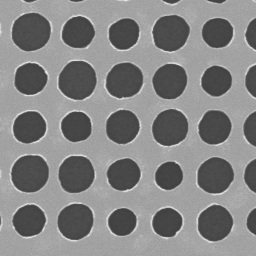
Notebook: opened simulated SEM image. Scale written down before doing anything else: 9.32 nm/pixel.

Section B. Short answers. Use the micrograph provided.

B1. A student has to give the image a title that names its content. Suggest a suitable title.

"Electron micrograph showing a regular array of holes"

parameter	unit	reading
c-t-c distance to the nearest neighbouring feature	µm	0.431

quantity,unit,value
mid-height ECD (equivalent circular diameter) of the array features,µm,0.312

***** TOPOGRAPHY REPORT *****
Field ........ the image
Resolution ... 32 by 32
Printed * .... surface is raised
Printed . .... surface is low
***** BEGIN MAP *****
********************************
********************************
**....***..****..***...***..****
**....**....**...**.....*....**.
**....**....**...**.....*....**.
**....**...***...**....***..***.
********************************
********************************
**...***....**...***...***..***.
**....*.....*.....*....**....**.
**....*.....*.....*....**....**.
***..***....**...***...***..***.
********************************
********************************
**...***...***...***...***..***.
**....**...**....**....**....**.
**....**...**....**....**....**.
**...****..***...***...**...***.
********************************
***..****.**********************
**....**...***...***..***....**.
*.....*.....*.....**...**....**.
*.....*.....*....**....**....**.
**...***...***...***..***...***.
********************************
*********.**********************
**...***...***...***..***....**.
**....*.....**...**....**....**.
**...**....***...**....**....**.
***.****...*********..***...****
********************************
********************************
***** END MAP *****